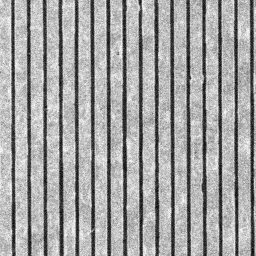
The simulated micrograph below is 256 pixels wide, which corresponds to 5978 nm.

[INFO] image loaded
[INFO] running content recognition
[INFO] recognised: parallel lines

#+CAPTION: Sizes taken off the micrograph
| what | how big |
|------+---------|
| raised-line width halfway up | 263 nm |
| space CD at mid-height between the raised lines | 114 nm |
